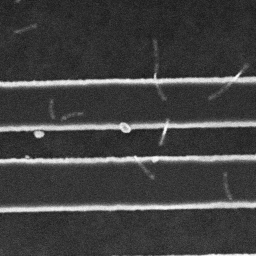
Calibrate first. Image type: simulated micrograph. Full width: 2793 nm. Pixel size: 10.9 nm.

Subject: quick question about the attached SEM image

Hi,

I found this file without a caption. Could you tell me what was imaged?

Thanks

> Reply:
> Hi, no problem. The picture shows lines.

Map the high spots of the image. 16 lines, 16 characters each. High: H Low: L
LLLLLLLLLLLLLLLL
LLLLLLLLLLLLLLLL
LLLLLLLLLLLLLLLL
LLLLLLLLLLLLLLLL
LLLLLLLLLLLLLLLL
HHHHHHHHHHHHHHHH
HHHHHHHHHHHHHHHH
HHHHHHHHHHHHHHHH
LLLLLLLLLLLLLLLL
LLLLLLLLLLLLLLLL
HHHHHHHHHHHHHHHH
HHHHHHHHHHHHHHHH
HHHHHHHHHHHHHHHH
LLLLLLLLLLLLLLLL
LLLLLLLLLLLLLLLL
LLLLLLLLLLLLLLLL